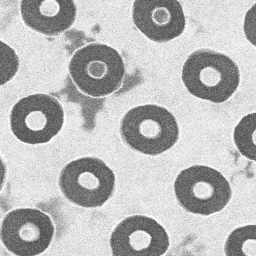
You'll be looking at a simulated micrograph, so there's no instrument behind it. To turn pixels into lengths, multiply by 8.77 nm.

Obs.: ring-shaped grooves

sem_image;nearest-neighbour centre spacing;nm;701